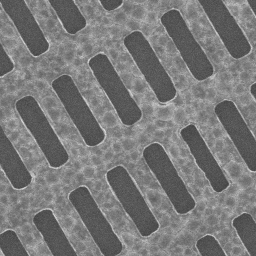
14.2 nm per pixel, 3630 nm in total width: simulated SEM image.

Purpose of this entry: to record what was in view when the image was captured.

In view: a regular array of holes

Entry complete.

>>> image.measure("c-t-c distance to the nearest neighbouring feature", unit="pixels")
42